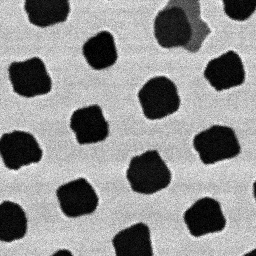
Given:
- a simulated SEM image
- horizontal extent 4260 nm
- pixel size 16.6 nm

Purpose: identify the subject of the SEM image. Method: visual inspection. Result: a regular array of holes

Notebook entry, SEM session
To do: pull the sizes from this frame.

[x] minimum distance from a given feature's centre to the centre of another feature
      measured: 1230 nm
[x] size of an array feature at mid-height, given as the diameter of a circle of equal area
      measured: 660 nanometers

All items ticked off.